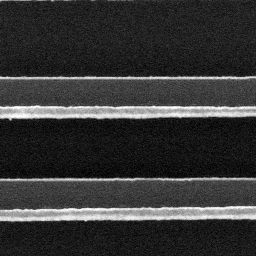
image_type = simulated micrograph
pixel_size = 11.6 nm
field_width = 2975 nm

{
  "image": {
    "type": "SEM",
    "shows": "lines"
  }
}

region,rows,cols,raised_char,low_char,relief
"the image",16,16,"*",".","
................
................
................
................
................
****************
****************
................
................
................
................
****************
****************
****************
................
................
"